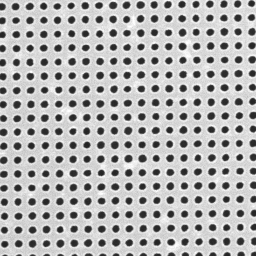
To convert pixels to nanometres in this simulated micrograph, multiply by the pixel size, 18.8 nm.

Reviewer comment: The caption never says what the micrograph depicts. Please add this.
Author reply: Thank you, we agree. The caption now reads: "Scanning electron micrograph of a regular array of holes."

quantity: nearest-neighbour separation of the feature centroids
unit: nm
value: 256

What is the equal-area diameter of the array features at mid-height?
144 nm